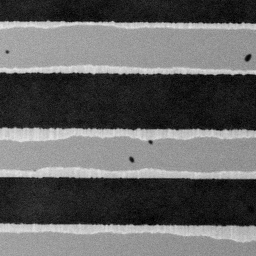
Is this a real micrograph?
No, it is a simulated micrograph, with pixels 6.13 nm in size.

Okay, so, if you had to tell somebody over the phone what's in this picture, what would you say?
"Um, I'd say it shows lines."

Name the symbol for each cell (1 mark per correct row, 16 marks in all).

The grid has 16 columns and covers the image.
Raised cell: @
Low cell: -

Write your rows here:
----------------
-@-@@@@---------
@@@@@@@@@@@@@@@@
@@@@@@@@@@@@@@@@
-------------@@@
----------------
----------------
----------------
@@@@@@@@@@@@@@@@
@@@@@@@@@@@@@@@@
@@@@@@@@@@@@@@@@
----------------
----------------
----------------
@@@@@@@@@@@@@@--
@@@@@@@@@@@@@@@@